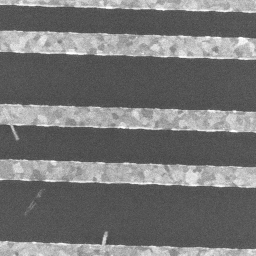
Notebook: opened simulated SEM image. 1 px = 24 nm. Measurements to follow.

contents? lines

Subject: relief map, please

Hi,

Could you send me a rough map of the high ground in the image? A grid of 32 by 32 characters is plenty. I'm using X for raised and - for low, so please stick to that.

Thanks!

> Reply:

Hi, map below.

XXXXXXXXXXXXXXXXXXXXXXXXXXXXXXXX
--------------------------------
--------------------------------
--------------------------------
XXXXXXXXXXXXXXXXXXXX------------
XXXXXXXXXXXXXXXXXXXXXXXXXXXXXXXX
-----XXXXXXXXXXXXXXXXXXXXXXXXXXX
--------------------------------
--------------------------------
--------------------------------
--------------------------------
--------------------------------
--------------------------------
XXXXXXXXXXXXX-------------------
XXXXXXXXXXXXXXXXXXXXXXXXXXXXXXXX
-XXXXXXXXXXXXXXXXXXXXXXXXXXXXXXX
-------------------------------X
--------------------------------
--------------------------------
--------------------------------
XXXXXXXXXXXXXXXXX---------------
XXXXXXXXXXXXXXXXXXXXXXXXXXXXXXXX
-----XXXXXXXXXXXXXXXXXXXXXXXXXXX
--------------------------------
--------------------------------
--------------------------------
--------------------------------
--------------------------------
--------------------------------
--------------------------------
XXXXXX------X-------------------
XXXXXXXXXXXXXXXXXXXXXXXXXXXXXXXX